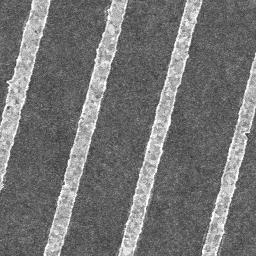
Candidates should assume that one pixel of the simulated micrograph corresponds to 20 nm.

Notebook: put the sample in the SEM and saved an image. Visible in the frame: one or a few lines or trenches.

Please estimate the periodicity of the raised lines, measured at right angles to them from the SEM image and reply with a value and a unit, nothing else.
1500 nanometres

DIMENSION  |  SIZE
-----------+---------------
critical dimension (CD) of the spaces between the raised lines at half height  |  1.17 micrometres